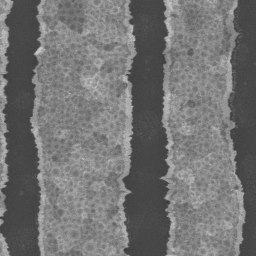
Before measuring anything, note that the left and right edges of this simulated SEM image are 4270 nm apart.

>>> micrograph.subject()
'one or a few lines or trenches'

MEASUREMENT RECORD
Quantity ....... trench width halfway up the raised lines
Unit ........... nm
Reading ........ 630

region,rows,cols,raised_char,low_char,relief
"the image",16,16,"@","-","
---@@@@@---@@@@-
---@@@@@---@@@--
---@@@@@---@@@@-
--@@@@@@---@@@--
--@@@@@@--@@@@--
--@@@@@@--@@@@--
--@@@@@@--@@@@--
--@@@@@@--@@@@--
--@@@@@@---@@@--
---@@@@@---@@@@-
---@@@@@---@@@@-
---@@@@@---@@@@-
---@@@@@---@@@@-
---@@@@@---@@@@-
---@@@@@---@@@@-
---@@@@@---@@@@-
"